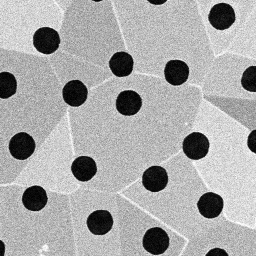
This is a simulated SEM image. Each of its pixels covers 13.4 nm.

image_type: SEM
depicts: a regular array of holes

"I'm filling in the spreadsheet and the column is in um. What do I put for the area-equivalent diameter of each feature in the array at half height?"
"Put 0.355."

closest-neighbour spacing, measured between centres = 732 nm